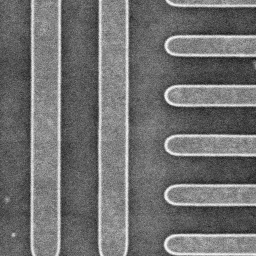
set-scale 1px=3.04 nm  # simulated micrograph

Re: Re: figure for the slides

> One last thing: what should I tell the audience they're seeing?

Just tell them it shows groups of lines, slits or small figures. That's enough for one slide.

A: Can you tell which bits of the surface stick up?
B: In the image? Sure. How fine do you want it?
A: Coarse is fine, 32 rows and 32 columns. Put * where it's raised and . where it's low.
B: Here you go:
....***......***.....***********
....***......***................
....***......***................
....***......***................
....***......***................
....***......***.....***********
....***......***.....***********
....***......***................
....***......***................
....***......***................
....***......***................
....***......***.....***********
....***......***.....***********
....***......***................
....***......***................
....***......***................
....***......***................
....***.....****.....***********
....***.....****.....***********
....***.....****................
....***......***................
....***......***................
....***......***................
....***......***.....***********
....***......***.....***********
....***......***......**********
....***......***................
....***......***................
....***......***................
....***......***......**********
....***......***.....***********
....***......***.....***********